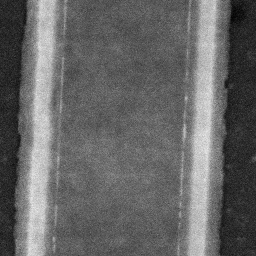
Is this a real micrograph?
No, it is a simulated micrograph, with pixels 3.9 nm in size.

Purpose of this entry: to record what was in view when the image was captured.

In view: one or a few lines or trenches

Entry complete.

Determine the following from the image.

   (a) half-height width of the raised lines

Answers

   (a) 638 nm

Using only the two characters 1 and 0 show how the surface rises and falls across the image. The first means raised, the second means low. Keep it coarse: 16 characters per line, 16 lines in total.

0001111111111000
0001111111111000
0001111111111000
0001111111111000
0001111111111000
0001111111111000
0001111111111000
0001111111111000
0001111111111000
0011111111111000
0011111111111000
0011111111111000
0011111111111000
0011111111110000
0011111111110000
0011111111110000